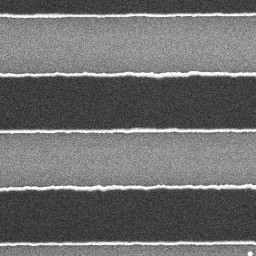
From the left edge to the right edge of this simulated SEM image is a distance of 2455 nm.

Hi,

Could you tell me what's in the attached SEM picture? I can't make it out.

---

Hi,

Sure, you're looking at lines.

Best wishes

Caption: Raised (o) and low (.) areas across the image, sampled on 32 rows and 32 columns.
oooooooooooooooooooooooooooooooo
oooooooooooooooooooooooooooooooo
................................
................................
................................
................................
................................
................................
................................
oooooooooooooooooooooooooooooooo
oooooooooooooooooooooooooooooooo
oooooooooooooooooooooooooooooooo
oooooooooooooooooooooooooooooooo
oooooooooooooooooooooooooooooooo
oooooooooooooooooooooooooooooooo
oooooooooooooooooooooooooooooooo
ooooooo.o...ooo.................
................................
................................
................................
................................
................................
................................
...ooooooooooooooooooooooooooooo
oooooooooooooooooooooooooooooooo
oooooooooooooooooooooooooooooooo
oooooooooooooooooooooooooooooooo
oooooooooooooooooooooooooooooooo
oooooooooooooooooooooooooooooooo
oooooooooooooooooooooooooooooooo
ooooooooooooooooooooooo.oo.....o
................................